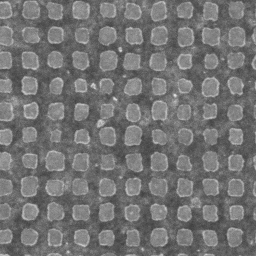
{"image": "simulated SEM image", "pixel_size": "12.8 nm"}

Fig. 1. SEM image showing a regular array of raised bodies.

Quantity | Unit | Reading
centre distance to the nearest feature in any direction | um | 0.315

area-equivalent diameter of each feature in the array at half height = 0.211 µm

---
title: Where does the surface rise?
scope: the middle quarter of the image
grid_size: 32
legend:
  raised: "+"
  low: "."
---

...+++...++++..++++...+++....+++
.......................++.......
................................
................................
...++....+++....+++...+++....++.
...++....+++...++++...+++....+++
...++....+++...++++...+++....+++
................++.....++.......
................................
.......................++.......
...+++...+++....++....++++...++.
...+++...+++....+++...++++...+++
...+++...+++....+++...+++...++++
...++...........+++...+++....++.
................................
................................
....+....+++....+++..........++.
...+++...++++..++++...+++....+++
...+++...++++..++++...+++....+++
...+++...++++..++++....+++...+++
................................
................................
.....+...........++...++........
...+++...+++...++++...+++....++.
..++++...+++....+++...++++..+++.
..++++...++++...+++...++++..++++
...+++...........++...+++.....+.
................................
................................
..++++...+++....+++...+++....+++
..++++...++++...+++..+++++...+++
..++++...++++...+++...++++..++++